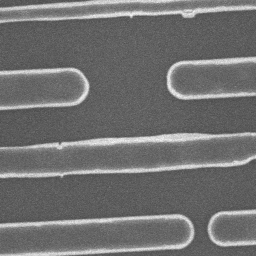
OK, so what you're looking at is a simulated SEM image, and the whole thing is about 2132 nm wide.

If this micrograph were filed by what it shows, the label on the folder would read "one or a few lines or trenches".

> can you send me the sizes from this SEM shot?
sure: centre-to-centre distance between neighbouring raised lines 0.627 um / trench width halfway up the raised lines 393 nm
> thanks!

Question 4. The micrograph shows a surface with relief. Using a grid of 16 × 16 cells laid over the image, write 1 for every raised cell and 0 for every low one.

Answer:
0111111111111111
0000000000000000
0000000000000000
0000000000000000
0111100000011111
1111100000011111
1111100000000000
0000000000000000
0000000000011111
1111111111111111
1111111111100000
0000000000000000
0000000000000000
0000000000100011
1111111111110111
1111111111000000